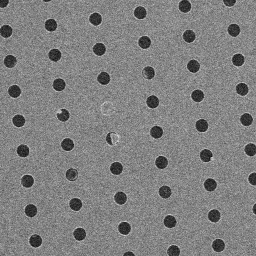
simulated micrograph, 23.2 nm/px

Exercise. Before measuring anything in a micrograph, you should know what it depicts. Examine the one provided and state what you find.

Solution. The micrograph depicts a regular array of holes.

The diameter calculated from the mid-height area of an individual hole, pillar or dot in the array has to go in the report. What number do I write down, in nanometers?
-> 318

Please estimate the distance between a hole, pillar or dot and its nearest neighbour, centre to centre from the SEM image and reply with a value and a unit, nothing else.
0.696 micrometres